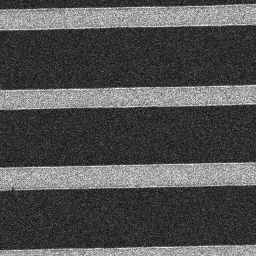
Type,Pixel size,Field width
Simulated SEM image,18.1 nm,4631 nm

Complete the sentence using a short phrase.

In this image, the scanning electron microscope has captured one or a few lines or trenches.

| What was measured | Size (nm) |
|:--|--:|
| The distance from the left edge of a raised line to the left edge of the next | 1450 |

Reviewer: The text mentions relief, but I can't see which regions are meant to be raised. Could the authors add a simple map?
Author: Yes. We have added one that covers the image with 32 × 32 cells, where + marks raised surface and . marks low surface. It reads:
++++++++++++++++++++++++++++++++
................................
................................
............++++++++++++++++++++
++++++++++++++++++++++++++++++++
++++++++++++++++++++++++++++++++
++++++++++++++++++++++++++++++++
++++++++++++++++++++++++++++++++
++++++++++++++++++++++++++++++++
++++++++++++++++++++++++++++++++
++++++++++++++++++++++++++++++++
................................
................................
........++++++++++++++++++++++++
++++++++++++++++++++++++++++++++
++++++++++++++++++++++++++++++++
++++++++++++++++++++++++++++++++
++++++++++++++++++++++++++++++++
++++++++++++++++++++++++++++++++
++++++++++++++++++++++++++++++++
+++++++++++++++++++++.++........
................................
................................
.+...........+++++++++++++++++++
++++++++++++++++++++++++++++++++
++++++++++++++++++++++++++++++++
++++++++++++++++++++++++++++++++
++++++++++++++++++++++++++++++++
++++++++++++++++++++++++++++++++
++++++++++++++++++++++++++++++++
++++++++++++++++++++++++++++++++
................................